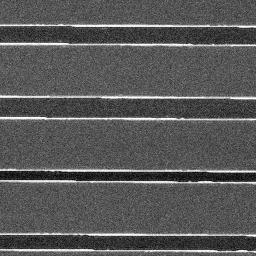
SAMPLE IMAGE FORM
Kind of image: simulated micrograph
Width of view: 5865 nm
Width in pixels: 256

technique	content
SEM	lines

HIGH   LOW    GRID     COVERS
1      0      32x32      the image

11111111111111111111111111111111
11111111111111111111111111111111
11111111111111111111111111111111
00000000000000000000000000000000
00000000000000000000000000000000
11111111100000000000000000000000
11111111111111111111111111111111
11111111111111111111111111111111
11111111111111111111111111111111
11111111111111111111111111111111
11111111111111111111111111111111
11111111111111111111111111111111
00000000000000000000000000000000
00000000000000000000000000000000
00000000000000000000000000000000
11111111111111111111111111111111
11111111111111111111111111111111
11111111111111111111111111111111
11111111111111111111111111111111
11111111111111111111111111111111
11111111111111111111111111111111
00000000000000000000000000000000
00000000000000000000000000000000
11111111111111111111111111111111
11111111111111111111111111111111
11111111111111111111111111111111
11111111111111111111111111111111
11111111111111111111111111111111
11111111111111111111111111111111
00000000000000000000000000000000
00000000000000000000000000000000
11111111111111111111111111111111